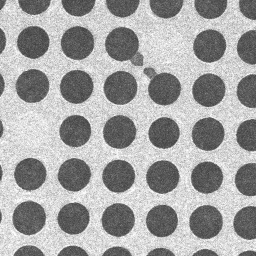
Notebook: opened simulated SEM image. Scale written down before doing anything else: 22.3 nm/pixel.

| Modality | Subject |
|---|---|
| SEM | a regular array of holes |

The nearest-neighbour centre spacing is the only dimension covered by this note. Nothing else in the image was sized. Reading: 975 nm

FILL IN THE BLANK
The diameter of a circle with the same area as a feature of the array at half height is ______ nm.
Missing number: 756